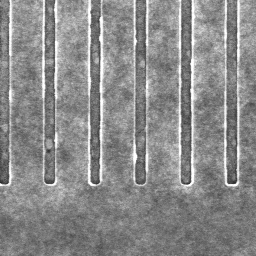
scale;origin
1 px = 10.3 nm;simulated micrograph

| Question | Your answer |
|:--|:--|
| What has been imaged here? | parallel lines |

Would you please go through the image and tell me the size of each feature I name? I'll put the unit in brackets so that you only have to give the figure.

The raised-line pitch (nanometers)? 467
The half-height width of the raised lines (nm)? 355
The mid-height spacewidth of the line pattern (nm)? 116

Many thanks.